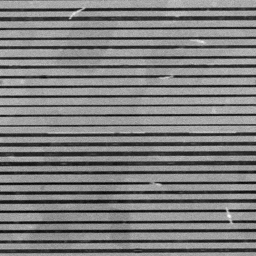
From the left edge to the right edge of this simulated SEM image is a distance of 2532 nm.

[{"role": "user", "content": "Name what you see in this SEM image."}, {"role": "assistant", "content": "parallel lines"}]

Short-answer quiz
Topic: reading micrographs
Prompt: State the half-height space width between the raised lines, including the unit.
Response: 32.2 nm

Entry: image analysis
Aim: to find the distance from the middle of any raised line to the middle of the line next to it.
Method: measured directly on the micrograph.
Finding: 0.0957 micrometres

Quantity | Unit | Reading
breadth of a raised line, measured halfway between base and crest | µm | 0.0643